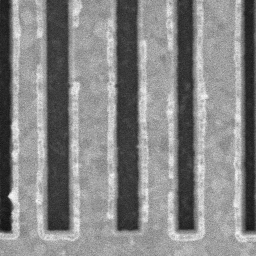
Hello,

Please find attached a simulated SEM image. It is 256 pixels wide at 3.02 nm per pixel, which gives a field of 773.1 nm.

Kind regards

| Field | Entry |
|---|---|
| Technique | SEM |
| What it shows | one or a few lines or trenches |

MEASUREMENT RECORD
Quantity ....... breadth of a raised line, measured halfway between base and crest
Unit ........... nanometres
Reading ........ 119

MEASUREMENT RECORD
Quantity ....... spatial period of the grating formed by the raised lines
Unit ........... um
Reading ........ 0.193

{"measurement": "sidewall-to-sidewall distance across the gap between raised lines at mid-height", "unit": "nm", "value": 78.2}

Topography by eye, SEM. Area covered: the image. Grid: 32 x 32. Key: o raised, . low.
..ooo....ooooo....oooo...ooooo..
..ooo....ooooo....oooo...ooooo..
..ooo....ooooo....oooo...ooooo..
..ooo....ooooo....oooo...ooooo..
..ooo....ooooo....oooo...ooooo..
..ooo....ooooo....oooo...ooooo..
..ooo....ooooo....oooo...ooooo..
..ooo....ooooo....oooo..oooooo..
..ooo....ooooo....oooo..oooooo..
..ooo....ooooo....oooo..oooooo..
..ooo....ooooo....oooo...ooooo..
..ooo....ooooo....oooo...ooooo..
..ooo....ooooo....oooo...ooooo..
..ooo....ooooo...ooooo...ooooo..
..ooo....ooooo...ooooo...ooooo..
..ooo....ooooo....oooo...ooooo..
..oooo...ooooo....oooo...ooooo..
..oooo...ooooo....oooo...ooooo..
..oooo...ooooo....oooo...ooooo..
..oooo...ooooo....oooo...ooooo..
..ooo....ooooo....oooo...ooooo..
..ooo....ooooo....oooo...ooooo..
..ooo....ooooo....oooo...ooooo..
..ooo....ooooo....oooo...ooooo..
.oooo....ooooo....oooo...ooooo..
..ooo....ooooo....oooo...ooooo..
..ooo....ooooo....oooo...ooooo..
..ooo....ooooo....oooo...ooooo..
..ooo....ooooo....oooo...ooooo..
oooooooooooooooooooooooooooooooo
oooooooooooooooooooooooooooooooo
oooooooooooooooooooooooooooooooo